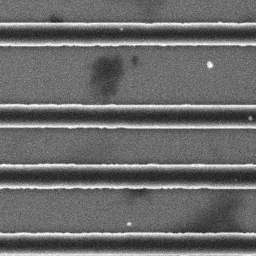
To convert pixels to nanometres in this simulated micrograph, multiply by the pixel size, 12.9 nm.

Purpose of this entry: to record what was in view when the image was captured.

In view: lines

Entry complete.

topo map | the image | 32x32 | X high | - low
--------------------------------
--------------------------------
--------------------------------
XXXXXXXXXXXXXXXXXXXXXXXXXXXXXXXX
XXXXXXXXXXXXXXXXXXXXXXXXXXXXXXXX
XXXXXXXXXXXXXXXXXXXXXXXXXXXXXXXX
--------------------------------
--------------------------------
--------------------------------
--------------------------------
--------------------------------
--------------------------------
--------------------------------
XXXXXXXXXXXXXXXXXXXXXXXXXXXXXXXX
XXXXXXXXXXXXXXXXXXXXXXXXXXXXXXXX
XXXXXXXXXXXXXXXXXXXXXXXXXXXXXXXX
--------------------------------
--------------------------------
--------------------------------
--------------------------------
--------------------------------
XXXXXXXXXXXXXXXXXXXXXXXXXXXXXXXX
XXXXXXXXXXXXXXXXXXXXXXXXXXXXXXXX
--------------------------------
--------------------------------
--------------------------------
--------------------------------
--------------------------------
--------------------------------
XXXXXXXXXXXXXXXXXXXXXXXXXXXXXXXX
XXXXXXXXXXXXXXXXXXXXXXXXXXXXXXXX
XXXXXXXXXXXXXXXXXXXXXXXXXXXXXXXX